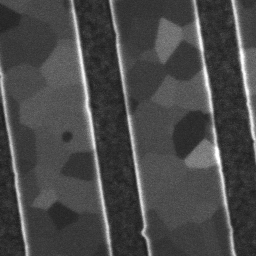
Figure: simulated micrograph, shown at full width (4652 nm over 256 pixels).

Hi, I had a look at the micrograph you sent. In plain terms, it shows one or a few lines or trenches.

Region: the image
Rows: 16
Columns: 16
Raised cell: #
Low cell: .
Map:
#####..#####...#
#####..#####...#
#####..######..#
#####..######..#
#####...#####..#
#####...#####..#
#####...#####...
######..#####...
.#####..#####...
.#####..######..
.#####..######..
.#####...#####..
.#####...#####..
.######..#####..
.######..#####..
..#####..######.